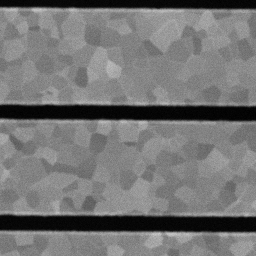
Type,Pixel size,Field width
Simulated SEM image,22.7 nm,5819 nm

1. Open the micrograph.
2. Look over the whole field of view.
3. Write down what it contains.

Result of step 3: lines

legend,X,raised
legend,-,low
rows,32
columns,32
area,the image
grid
--------------------------------
XXXXXXXXXXXXXXXXXXXXXXXXXXXXXXXX
XXXXXXXXXXXXXXXXXXXXXXXXXXXXXXXX
XXXXXXXXXXXXXXXXXXXXXXXXXXXXXXXX
XXXXXXXXXXXXXXXXXXXXXXXXXXXXXXXX
XXXXXXXXXXXXXXXXXXXXXXXXXXXXXXXX
XXXXXXXXXXXXXXXXXXXXXXXXXXXXXXXX
XXXXXXXXXXXXXXXXXXXXXXXXXXXXXXXX
XXXXXXXXXXXXXXXXXXXXXXXXXXXXXXXX
XXXXXXXXXXXXXXXXXXXXXXXXXXXXXXXX
XXXXXXXXXXXXXXXXXXXXXXXXXXXXXXXX
XXXXXXXXXXXXXXXXXXXXXXXXXXXXXXXX
XXXXXXXXXXXXXXXXXXXXXXXXXXXXXXXX
--------------------------------
--------------------------------
XXXXXXXXXXXXXXXXXXXXXXXXXXXXXXXX
XXXXXXXXXXXXXXXXXXXXXXXXXXXXXXXX
XXXXXXXXXXXXXXXXXXXXXXXXXXXXXXXX
XXXXXXXXXXXXXXXXXXXXXXXXXXXXXXXX
XXXXXXXXXXXXXXXXXXXXXXXXXXXXXXXX
XXXXXXXXXXXXXXXXXXXXXXXXXXXXXXXX
XXXXXXXXXXXXXXXXXXXXXXXXXXXXXXXX
XXXXXXXXXXXXXXXXXXXXXXXXXXXXXXXX
XXXXXXXXXXXXXXXXXXXXXXXXXXXXXXXX
XXXXXXXXXXXXXXXXXXXXXXXXXXXXXXXX
XXXXXXXXXXXXXXXXXXXXXXXXXXXXXXXX
XXXXXXXXXXXXXXXXXXXXXXXXXXXXXXXX
--------------------------------
--------------------------------
XXXXXXXXXXXXXXXXXXXXXXXXXXXXXXXX
XXXXXXXXXXXXXXXXXXXXXXXXXXXXXXXX
XXXXXXXXXXXXXXXXXXXXXXXXXXXXXXXX